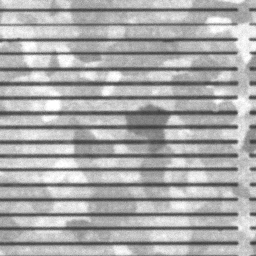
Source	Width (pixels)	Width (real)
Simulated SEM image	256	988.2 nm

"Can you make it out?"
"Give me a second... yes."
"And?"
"parallel lines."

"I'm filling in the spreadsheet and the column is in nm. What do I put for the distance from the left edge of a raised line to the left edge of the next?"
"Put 56.2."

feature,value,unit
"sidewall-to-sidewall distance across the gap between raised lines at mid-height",18.3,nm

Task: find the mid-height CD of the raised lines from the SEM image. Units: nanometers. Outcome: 40